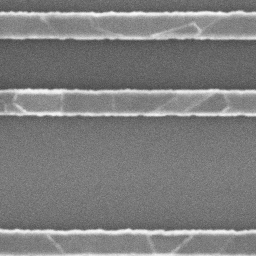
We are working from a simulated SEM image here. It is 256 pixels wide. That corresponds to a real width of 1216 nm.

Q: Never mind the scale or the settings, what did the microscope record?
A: lines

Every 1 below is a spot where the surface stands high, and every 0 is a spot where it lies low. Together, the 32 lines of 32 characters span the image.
00000000000000000000000000000000
00000000000000000000000000000000
11111111111111111111111111111111
11111111111111111111111111111111
11111111111111111111111111111111
00000000000000000000000000000000
00000000000000000000000000000000
00000000000000000000000000000000
00000000000000000000000000000000
00000000000000000000000000000000
00000000000000000000000000000000
11111111111111111111111111111111
11111111111111111111111111111111
11111111111111111111111111111111
00000000000000000000000000000000
00000000000000000000000000000000
00000000000000000000000000000000
00000000000000000000000000000000
00000000000000000000000000000000
00000000000000000000000000000000
00000000000000000000000000000000
00000000000000000000000000000000
00000000000000000000000000000000
00000000000000000000000000000000
00000000000000000000000000000000
00000000000000000000000000000000
00000000000000000000000000000000
00000000000000000000000000000000
00000000000000000000000000000000
11111111111111111111111111111111
11111111111111111111111111111111
11111111111111111111111111111111